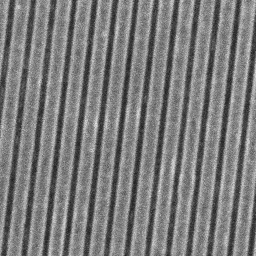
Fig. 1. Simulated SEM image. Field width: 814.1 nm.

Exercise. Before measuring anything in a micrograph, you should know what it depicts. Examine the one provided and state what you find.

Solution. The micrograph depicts parallel lines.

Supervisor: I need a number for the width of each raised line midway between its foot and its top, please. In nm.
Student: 44.6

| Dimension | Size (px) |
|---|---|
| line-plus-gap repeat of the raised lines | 20.4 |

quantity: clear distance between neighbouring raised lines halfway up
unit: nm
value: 19.7